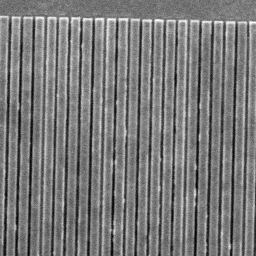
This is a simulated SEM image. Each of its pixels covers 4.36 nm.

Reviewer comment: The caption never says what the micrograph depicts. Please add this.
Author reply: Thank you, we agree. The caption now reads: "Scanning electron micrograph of parallel lines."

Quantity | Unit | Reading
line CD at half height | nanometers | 38.2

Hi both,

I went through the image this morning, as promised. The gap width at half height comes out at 11.5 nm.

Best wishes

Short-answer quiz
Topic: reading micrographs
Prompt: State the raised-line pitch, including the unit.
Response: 52 nm